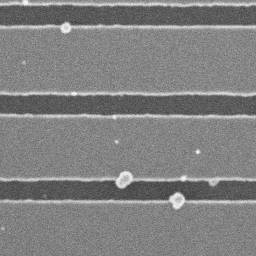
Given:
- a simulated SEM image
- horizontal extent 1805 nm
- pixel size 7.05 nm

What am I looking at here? lines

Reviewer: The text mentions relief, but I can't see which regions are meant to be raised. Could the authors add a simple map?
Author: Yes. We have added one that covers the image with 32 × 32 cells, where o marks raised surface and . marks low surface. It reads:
oooooooooooooooooooooooooooooooo
................................
................................
oooooooooooooooooooooooooooooooo
oooooooooooooooooooooooooooooooo
oooooooooooooooooooooooooooooooo
oooooooooooooooooooooooooooooooo
oooooooooooooooooooooooooooooooo
oooooooooooooooooooooooooooooooo
oooooooooooooooooooooooooooooooo
oooooooooooooooooooooooooooooooo
oooooooooooooooooooooooooooooooo
................................
................................
ooooooooooooo.ooooooooo...oo.oo.
oooooooooooooooooooooooooooooooo
oooooooooooooooooooooooooooooooo
oooooooooooooooooooooooooooooooo
oooooooooooooooooooooooooooooooo
oooooooooooooooooooooooooooooooo
oooooooooooooooooooooooooooooooo
oooooooooooooooooooooooooooooooo
ooooo.....ooo.ooooooooooooo...oo
................................
.....................oo.........
oooooooooooooooooooooooooooooooo
oooooooooooooooooooooooooooooooo
oooooooooooooooooooooooooooooooo
oooooooooooooooooooooooooooooooo
oooooooooooooooooooooooooooooooo
oooooooooooooooooooooooooooooooo
oooooooooooooooooooooooooooooooo